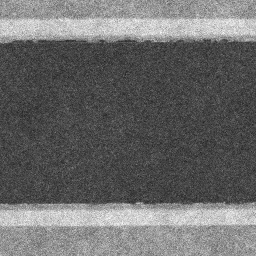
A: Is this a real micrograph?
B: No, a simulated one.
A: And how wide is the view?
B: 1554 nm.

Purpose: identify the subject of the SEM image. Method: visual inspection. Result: one or a few lines or trenches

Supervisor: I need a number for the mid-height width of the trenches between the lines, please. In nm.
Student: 1160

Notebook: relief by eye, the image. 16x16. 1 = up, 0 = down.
1111111111111111
1111111111111111
0000000000000000
0000000000000000
0000000000000000
0000000000000000
0000000000000000
0000000000000000
0000000000000000
0000000000000000
0000000000000000
0000000000000000
0000000000000000
0000000000000000
1111111111111111
1111111111111111